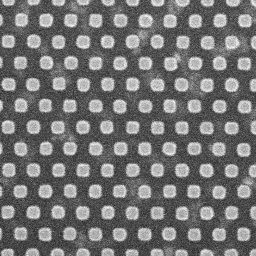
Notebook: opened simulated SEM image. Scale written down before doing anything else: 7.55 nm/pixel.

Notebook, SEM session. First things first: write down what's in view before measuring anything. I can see a regular array of raised bodies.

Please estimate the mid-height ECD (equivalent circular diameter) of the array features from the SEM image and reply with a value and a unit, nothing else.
0.0952 um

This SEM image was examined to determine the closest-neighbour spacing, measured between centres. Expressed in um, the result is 0.183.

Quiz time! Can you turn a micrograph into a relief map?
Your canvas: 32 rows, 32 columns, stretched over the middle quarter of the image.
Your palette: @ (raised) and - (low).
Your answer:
@@@----@@----@@----@@@---@@@---@
--------------------------------
--------------------------------
--------------------------------
----@@----@@----@@----@@@---@@@-
----@@----@@----@@----@@@---@@@-
----@@----------@@----@@----@@--
--------------------------------
--------------------------------
@@@----@@----@@----@@----@@@---@
@@@----@@----@@----@@@---@@@---@
@@@----@@----@@----@@@---@@@---@
--------------------------------
--------------------------------
----------@@--------------------
---@@@---@@@----@@----@@@---@@@-
---@@@---@@@----@@----@@@---@@@-
--------------------------------
--------------------------------
--------------------------------
@@@----@@----@@@---@@----@@@---@
@@@----@@----@@@---@@----@@@---@
-@-----@@----@@----@@-----------
--------------------------------
--------------------------------
----@@----@@----@@----@@@---@@@-
---@@@----@@----@@@---@@@---@@@-
---@@@----@@----@@----@@@---@@@-
--------------------------------
--------------------------------
@@------------------------------
@@@---@@@----@@----@@----@@@---@